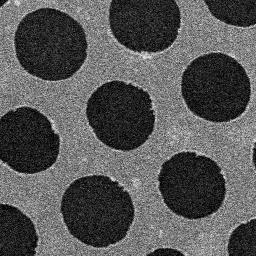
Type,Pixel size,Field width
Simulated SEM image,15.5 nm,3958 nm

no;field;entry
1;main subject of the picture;holes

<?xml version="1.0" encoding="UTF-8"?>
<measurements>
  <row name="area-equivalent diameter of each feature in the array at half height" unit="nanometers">1090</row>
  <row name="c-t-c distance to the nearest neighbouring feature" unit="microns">1.52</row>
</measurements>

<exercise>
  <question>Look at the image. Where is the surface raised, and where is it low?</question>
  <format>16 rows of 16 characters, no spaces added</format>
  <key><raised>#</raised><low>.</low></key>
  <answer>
#######....##...
#....##....###..
#....##....#####
#....########.##
##...#######...#
######...##.....
#####....###....
...##.....###.##
....##...#######
....############
#..#######....##
####...###....##
####....##....##
..##....###..###
..##....#######.
..############..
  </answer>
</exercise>